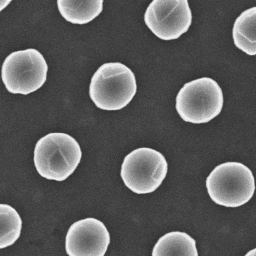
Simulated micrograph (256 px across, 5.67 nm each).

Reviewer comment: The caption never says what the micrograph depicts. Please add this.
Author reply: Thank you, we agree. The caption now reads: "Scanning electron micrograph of raised bodies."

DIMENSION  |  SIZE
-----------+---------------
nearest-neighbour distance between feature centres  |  498 nm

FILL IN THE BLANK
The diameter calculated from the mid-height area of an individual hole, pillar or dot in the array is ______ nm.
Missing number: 256